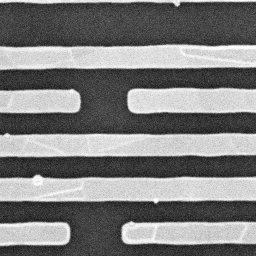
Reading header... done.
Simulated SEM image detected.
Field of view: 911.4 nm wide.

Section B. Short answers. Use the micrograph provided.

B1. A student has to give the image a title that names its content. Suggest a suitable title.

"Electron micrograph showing wiring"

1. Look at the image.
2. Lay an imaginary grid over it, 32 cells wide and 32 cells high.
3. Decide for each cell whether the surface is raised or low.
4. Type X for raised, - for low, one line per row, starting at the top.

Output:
--------------------------------
--------------------------------
--------------------------------
--------------------------------
--------------------------------
--------------------------------
XXXXXXXXXXXXXXXXXXXXXXXXXXXXXXXX
XXXXXXXXXXXXXXXXXXXXXXXXXXXXXXXX
XXXXXX--------------------------
--------------------------------
--------------------------------
XXXXXXXXXX------XXXXXXXXXXXXXXXX
XXXXXXXXXX------XXXXXXXXXXXXXXXX
XXXXXXXXXX------XXXXXXXXXXXXXXXX
--------------------------------
--------------------------------
--------------------------------
XXXXXXXXXXXXXXXXXXXXXXXXXXXXXXXX
XXXXXXXXXXXXXXXXXXXXXXXXXXXXXXXX
X-XXXXX-------------------------
--------------------------------
--------------------------------
XXXXXXXXXXXXXXXXXXXXXXXXXXXXXXXX
XXXXXXXXXXXXXXXXXXXXXXXXXXXXXXXX
XXXXXXXXXXXXXXXXXXXXXXXXXXXXXXXX
--------------------------------
--------------------------------
--------------------------------
XXXXXXXXX------XXXXXXXXXXXXXXXXX
XXXXXXXXX------XXXXXXXXXXXXXXXXX
XXXXXXXX-------------XXXX-------
--------------------------------